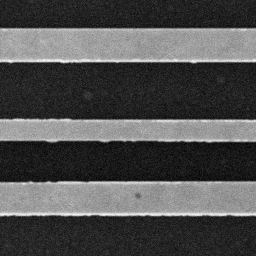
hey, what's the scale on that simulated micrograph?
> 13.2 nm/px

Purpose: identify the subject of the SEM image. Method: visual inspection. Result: lines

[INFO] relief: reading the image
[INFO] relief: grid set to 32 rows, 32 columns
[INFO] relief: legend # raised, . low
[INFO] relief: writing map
................................
................................
................................
................................
################################
################################
################################
################################
................................
................................
................................
................................
................................
................................
................................
################################
################################
################################
................................
................................
................................
................................
................................
################################
################################
################################
################################
................................
................................
................................
................................
................................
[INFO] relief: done